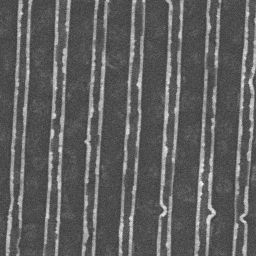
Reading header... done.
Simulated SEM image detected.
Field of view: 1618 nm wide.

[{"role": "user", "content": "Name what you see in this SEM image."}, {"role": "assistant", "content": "parallel lines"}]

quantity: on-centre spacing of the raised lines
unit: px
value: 37.7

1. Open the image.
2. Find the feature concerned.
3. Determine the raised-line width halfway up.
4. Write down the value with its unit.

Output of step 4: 84.5 nanometers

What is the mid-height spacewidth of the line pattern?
153 nanometers